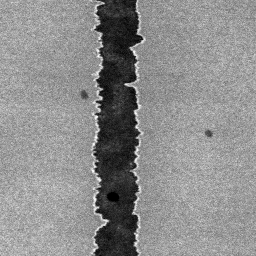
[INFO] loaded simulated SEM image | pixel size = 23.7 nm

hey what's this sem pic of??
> one or a few lines or trenches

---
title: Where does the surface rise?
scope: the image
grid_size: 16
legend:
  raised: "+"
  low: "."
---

++++++...+++++++
++++++...+++++++
++++++...+++++++
++++++..++++++++
++++++...+++++++
++++++..++++++++
++++++...+++++++
++++++...+++++++
++++++...+++++++
++++++...+++++++
++++++..++++++++
++++++...+++++++
++++++...+++++++
++++++...+++++++
++++++...+++++++
++++++...+++++++